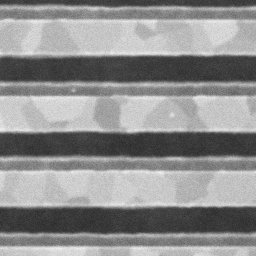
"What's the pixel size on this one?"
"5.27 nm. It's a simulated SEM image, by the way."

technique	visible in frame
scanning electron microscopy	lines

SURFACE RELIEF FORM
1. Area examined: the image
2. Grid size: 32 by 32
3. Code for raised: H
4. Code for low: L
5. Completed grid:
LLLLLLLLLLLLLLLLLLLLLLLLLLLLLLLL
HHHHHHHHHHHHHHHHHHHHHHHHHHHHHHHH
HHHHHHHHHHHHHHHHHHHHHHHHHHHHHHHH
HHHHHHHHHHHHHHHHHHHHHHHHHHHHHHHH
HHHHHHHHHHHHHHHHHHHHHHHHHHHHHHHH
HHHHHHHHHHHHHHHHHHHHHHHHHHHHHHHH
HHHHHHHHHHHHHHHHHHHHHHHHHHHHHHHH
LLLLLLLLLLLLLLLLLLLLLLLLLLLLLLLL
LLLLLLLLLLLLLLLLLLLLLLLLLLLLLLLL
LLLLLLLLLLLLLLLLLLLLLLLLLLLLLLLL
LLLLLLLLLLLLLLLLLLLLLLLLLLLLLLLL
HHHHHHHHHHHHHHHHHHHHHHHHHHHHHHHH
HHHHHHHHHHHHHHHHHHHHHHHHHHHHHHHH
HHHHHHHHHHHHHHHHHHHHHHHHHHHHHHHH
HHHHHHHHHHHHHHHHHHHHHHHHHHHHHHHH
HHHHHHHHHHHHHHHHHHHHHHHHHHHHHHHH
LLLLLLLLLLLLLLLLLLLLLLLLLLLLLLLL
LLLLLLLLLLLLLLLLLLLLLLLLLLLLLLLL
LLLLLLLLLLLLLLLLLLLLLLLLLLLLLLLL
LLLLLLLLLLLLLLLLLLLLLLLLLLLLLLLL
HHHHHHHHHHHHHHHHHHHHHHHHHHHHHHHH
HHHHHHHHHHHHHHHHHHHHHHHHHHHHHHHH
HHHHHHHHHHHHHHHHHHHHHHHHHHHHHHHH
HHHHHHHHHHHHHHHHHHHHHHHHHHHHHHHH
HHHHHHHHHHHHHHHHHHHHHHHHHHHHHHHH
HHHHHHHHHHHHHHHHHHHHHHHHHHHHHHHH
LLLLLLLLLLLLLLLLLLLLLLLLLLLLLLLL
LLLLLLLLLLLLLLLLLLLLLLLLLLLLLLLL
LLLLLLLLLLLLLLLLLLLLLLLLLLLLLLLL
HHHHHHHHHHHHHHHHHHHHHHHHHHHHHHHH
HHHHHHHHHHHHHHHHHHHHHHHHHHHHHHHH
HHHHHHHHHHHHHHHHHHHHHHHHHHHHHHHH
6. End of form